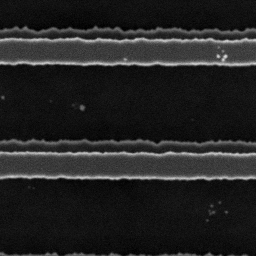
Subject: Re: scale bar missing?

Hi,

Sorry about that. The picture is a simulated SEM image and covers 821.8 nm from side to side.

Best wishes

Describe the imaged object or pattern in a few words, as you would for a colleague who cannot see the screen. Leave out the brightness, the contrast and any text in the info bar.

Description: lines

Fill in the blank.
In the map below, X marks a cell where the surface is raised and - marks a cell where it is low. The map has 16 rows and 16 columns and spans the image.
----------------
----------------
XXXXXXXXXXXXXXXX
XXXXXXXXXXXXXXXX
----------------
----------------
----------------
----------------
----------------
XXXXXXXXXXXXXXXX
XXXXXXXXXXXXXXXX
----------------
----------------
----------------
----------------
----------------